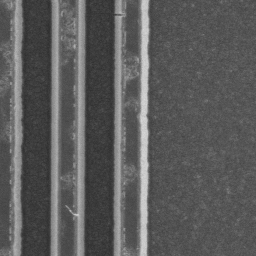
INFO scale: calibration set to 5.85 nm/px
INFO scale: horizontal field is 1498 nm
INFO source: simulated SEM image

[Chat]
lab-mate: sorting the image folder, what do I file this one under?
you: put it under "one or a few lines or trenches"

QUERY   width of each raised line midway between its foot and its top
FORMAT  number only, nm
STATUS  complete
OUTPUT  162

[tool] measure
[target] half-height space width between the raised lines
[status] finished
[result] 209 nm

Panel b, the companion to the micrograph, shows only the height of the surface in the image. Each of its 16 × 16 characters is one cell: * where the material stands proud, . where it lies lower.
*..**..**.......
*..**..**.......
*..**..**.......
*..**..**.......
*..**..**.......
*..**..**.......
*..**..**.......
*..**..**.......
*..**..**.......
*..**..**.......
*..**..**.......
*..**..**.......
*..**..**.......
*..**..**.......
*..**..**.......
*..**..**.......